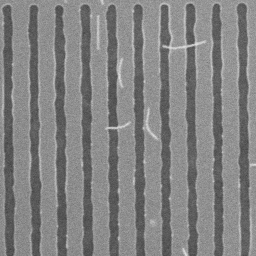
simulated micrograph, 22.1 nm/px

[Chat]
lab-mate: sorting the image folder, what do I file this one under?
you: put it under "groups of lines, slits or small figures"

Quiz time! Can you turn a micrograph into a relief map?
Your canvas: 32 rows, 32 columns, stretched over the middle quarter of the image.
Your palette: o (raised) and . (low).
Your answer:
oooo...oooo..oooo...oooo..oooo..
oooo...oooo..oooo...oooo..oooo..
oooo...oooo...ooo...oooo..oooo..
oooo...oooo...ooo...oooo..oooo..
oooo...oooo..oooo...oooo..oooo..
oooo...oooo..oooo...oooo...ooo..
.ooo...oooo..oooo...oooo...ooo..
oooo...oooo..oooo...oooo...oooo.
oooo...oooo..oooo...oooo...oooo.
oooo...oooo..oooo...oooo...oooo.
oooo...oooo..oooo...oooo...oooo.
oooo...oooo..oooo...oooo..oooo..
oooo...oooo..ooooo..oooo..oooo..
oooo...oooo..ooooo..oooo...ooo..
.ooo...oooo...oooo..oooo..ooooo.
.ooo...oooo...ooo...oooo..ooooo.
.ooo...oooo..oooo...oooo...oooo.
.ooo...oooo...ooo...oooo...oooo.
.ooo...oooo...oooo..oooo...oooo.
.ooo...oooo...oooo..oooo...oooo.
.ooo...oooo...oooo..oooo...oooo.
oooo...oooo...oooo..oooo...oooo.
oooo...oooo...oooo..oooo...oooo.
.ooo...oooo...oooo..oooo...oooo.
.ooo...oooo...oooo..oooo...oooo.
.ooo...oooo...oooo..oooo...oooo.
.oooo..oooo...oooo..oooo...oooo.
.oooo..oooo...oooo..oooo...oooo.
.oooo..oooo...ooo...oooo...oooo.
.oooo..oooo...ooo...oooo...oooo.
ooooo..oooo...ooo...oooo...oooo.
ooooo..oooo...oooo..oooo...oooo.